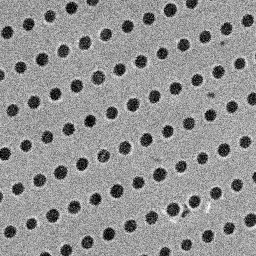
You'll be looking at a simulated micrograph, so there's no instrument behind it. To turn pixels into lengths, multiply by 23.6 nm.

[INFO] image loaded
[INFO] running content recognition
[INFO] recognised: a regular array of holes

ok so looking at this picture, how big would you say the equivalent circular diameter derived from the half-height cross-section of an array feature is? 321 nm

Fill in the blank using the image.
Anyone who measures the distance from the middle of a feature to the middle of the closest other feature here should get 539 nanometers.